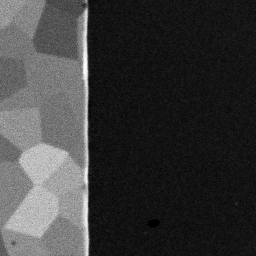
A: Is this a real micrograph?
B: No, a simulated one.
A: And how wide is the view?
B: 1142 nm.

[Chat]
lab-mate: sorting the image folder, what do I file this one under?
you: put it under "wiring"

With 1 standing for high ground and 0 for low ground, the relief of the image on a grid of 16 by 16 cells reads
1111100000000000
1111100000000000
1111100000000000
1111100000000000
1111100000000000
1111100000000000
1111100000000000
1111100000000000
1111100000000000
1111100000000000
1111100000000000
1111100000000000
1111100000000000
1111100000000000
1111110000000000
1111110000000000